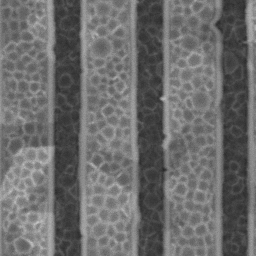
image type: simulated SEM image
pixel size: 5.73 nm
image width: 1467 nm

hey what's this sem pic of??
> one or a few lines or trenches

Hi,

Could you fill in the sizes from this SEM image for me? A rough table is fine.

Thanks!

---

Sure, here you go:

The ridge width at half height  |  0.291 um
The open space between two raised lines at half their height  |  0.192 µm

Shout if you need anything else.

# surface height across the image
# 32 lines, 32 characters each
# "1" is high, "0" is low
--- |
11111100000111111000011111100001
11111100000111111000011111100001
11111100000111111000011111100001
11111100000111111000011111100001
11111100001111111000011111100001
11111100000111111000011111100001
11111100000111111000011111100001
11111100000111111000011111100001
11111100000111111000011111100001
11111100000111111000011111100001
11111100000111111000011111100000
11111100000111111000011111100000
11111100000111111000011111100001
11111100000111111000011111100001
11111100000111111000011111100001
11111100001111111000011111100001
11111100001111111000011111100001
11111100001111111000011111100001
11111100001111111000011111100001
11111100001111111000011111100001
11111100001111111000011111100001
11111100001111111000011111100000
11111100001111111000011111100000
11111100001111111000011111100000
11111100000111111000011111100000
11111100000111111000011111100000
11111100000111111000011111100001
11111100000111111000011111100001
11111100000111111000011111100001
11111100000111111000011111100001
11111100000111111000011111100001
11111100000111111000011111100001